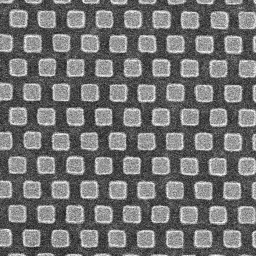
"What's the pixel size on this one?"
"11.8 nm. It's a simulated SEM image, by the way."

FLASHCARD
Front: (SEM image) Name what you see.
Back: a regular array of raised bodies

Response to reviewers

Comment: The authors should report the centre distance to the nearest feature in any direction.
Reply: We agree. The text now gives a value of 27.8 px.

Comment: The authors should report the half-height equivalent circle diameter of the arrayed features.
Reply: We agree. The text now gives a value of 217 nanometers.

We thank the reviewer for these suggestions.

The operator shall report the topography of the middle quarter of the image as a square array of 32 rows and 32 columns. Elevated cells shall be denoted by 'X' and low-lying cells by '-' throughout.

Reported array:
-XXXX---XXXX---XXXX---XXXX----XX
-XXXX---XXXX---XXXX---XXXX----XX
-XXXX---XXXX---XXXX---XXXX---XXX
--------------------------------
--------------------------------
X----XXX----XXX----XXX----XXXX--
X---XXXX---XXXXX--XXXXX---XXXX--
X----XXX---XXXXX---XXXX---XXXX--
X----XXX----XXXX---XXXX---XXXX--
--------------------------------
--------------------------------
-XXX----XXX-----XXX---XXXX---XXX
-XXXX---XXXX---XXXX---XXXX---XXX
-XXXX---XXXX---XXXX---XXXX---XXX
-XXXX---XXXX---XXXX---XXXX---XXX
--------------------------------
--------------------------------
X----XXX----XXX----XXX----XXX---
X---XXXX---XXXX----XXXX---XXXX--
X---XXXX---XXXX----XXXX---XXXX--
X---XXXX---XXXX----XXXX---XXXX--
-------X------X-----------------
--------------------------------
-XXX----XXX----XXXX-------------
-XXXX---XXXX---XXXX---XXXX---XXX
-XXXX---XXXX---XXXX---XXXX---XXX
-XXXX---XXXX---XXXX---XXXX---XXX
-----------------------XXX----XX
--------------------------------
--------------------------X-----
X---XXXX---XXXX---XXXX----XXXX--
X---XXXX----XXX---XXXX----XXXX--